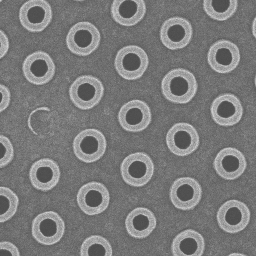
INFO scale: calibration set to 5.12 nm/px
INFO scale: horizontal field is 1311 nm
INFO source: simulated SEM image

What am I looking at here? a regular array of ring-shaped raised bodies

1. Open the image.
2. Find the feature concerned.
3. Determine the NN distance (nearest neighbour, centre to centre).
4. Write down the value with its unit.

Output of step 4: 272 nm